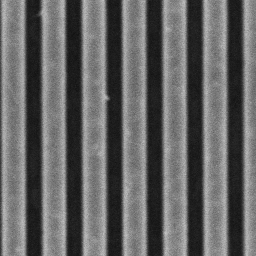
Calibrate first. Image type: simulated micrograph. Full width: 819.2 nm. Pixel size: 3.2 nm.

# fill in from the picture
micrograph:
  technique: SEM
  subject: parallel lines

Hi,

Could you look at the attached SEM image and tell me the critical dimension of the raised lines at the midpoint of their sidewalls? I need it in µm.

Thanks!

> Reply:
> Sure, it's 0.0795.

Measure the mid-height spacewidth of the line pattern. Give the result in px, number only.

15.1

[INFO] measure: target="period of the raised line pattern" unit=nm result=129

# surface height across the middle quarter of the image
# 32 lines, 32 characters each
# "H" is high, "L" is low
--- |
LLLLHHHHHHHLLLLHHHHHHLLLLHHHHHHL
LLLLHHHHHHHLLLLHHHHHHLLLLHHHHHHL
LLLLHHHHHHHLLLLHHHHHHLLLLHHHHHHL
LLLLHHHHHHHLLLLHHHHHHLLLLHHHHHHL
LLLLHHHHHHHLLLLHHHHHHLLLLHHHHHHL
LLLLLHHHHHHLLLLHHHHHHLLLLHHHHHHL
LLLLLHHHHHHLLLLHHHHHHLLLLHHHHHHL
LLLLLHHHHHHLLLLHHHHHHLLLLHHHHHHL
LLLLLHHHHHHLLLLHHHHHHLLLLHHHHHHL
LLLLLHHHHHHLLLLHHHHHHLLLLHHHHHHL
LLLLLHHHHHHLLLLHHHHHHLLLLHHHHHHL
LLLLLHHHHHHLLLLHHHHHHLLLLHHHHHHL
LLLLLHHHHHHLLLLHHHHHHLLLLHHHHHHL
LLLLHHHHHHHLLLLHHHHHHLLLLHHHHHHL
LLLLLHHHHHHLLLLHHHHHHLLLLHHHHHHL
LLLLHHHHHHHLLLLHHHHHHLLLLHHHHHHL
LLLLLHHHHHHLLLLHHHHHHLLLLHHHHHHL
LLLLLHHHHHHLLLLHHHHHHLLLLHHHHHHL
LLLLLHHHHHHLLLLHHHHHHLLLLHHHHHHL
LLLLHHHHHHHLLLLHHHHHHLLLLHHHHHHL
LLLLHHHHHHHLLLLHHHHHHLLLLHHHHHHL
LLLLHHHHHHHLLLLHHHHHHLLLLHHHHHHL
LLLLHHHHHHHLLLLHHHHHHLLLLHHHHHHL
LLLLHHHHHHHLLLLHHHHHHLLLLHHHHHHL
LLLLHHHHHHHLLLLHHHHHHLLLLHHHHHHL
LLLLHHHHHHHLLLLHHHHHHLLLLHHHHHHL
LLLLHHHHHHLLLLLHHHHHHLLLLHHHHHHL
LLLLLHHHHHLLLLLHHHHHHLLLLHHHHHHL
LLLLLHHHHHHLLLLHHHHHHLLLLHHHHHHL
LLLLLHHHHHHLLLLHHHHHHLLLLHHHHHHL
LLLLLHHHHHHLLLLHHHHHHLLLLHHHHHHL
LLLLLHHHHHHLLLLHHHHHHLLLLHHHHHHL